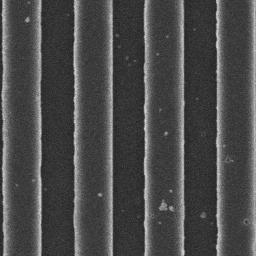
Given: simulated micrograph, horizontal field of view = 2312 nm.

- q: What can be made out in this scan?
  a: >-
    lines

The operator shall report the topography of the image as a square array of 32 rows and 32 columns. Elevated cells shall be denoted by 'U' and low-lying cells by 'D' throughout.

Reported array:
UUUUUDDDDUUUUUDDDDUUUUUDDDDUUUUU
UUUUUDDDDUUUUUDDDDUUUUUDDDDUUUUU
UUUUUDDDDUUUUUDDDDUUUUUDDDDUUUUU
UUUUUDDDDUUUUUDDDDUUUUUDDDDUUUUU
UUUUUDDDDUUUUUDDDDUUUUUDDDDUUUUU
UUUUUDDDDUUUUUDDDDUUUUUDDDDUUUUU
UUUUUDDDDUUUUUDDDDUUUUUDDDDUUUUU
UUUUUDDDDUUUUUDDDDUUUUUDDDDUUUUU
UUUUUDDDDUUUUUDDDDUUUUUDDDDUUUUU
UUUUUDDDDUUUUUDDDDUUUUUDDDDUUUUU
UUUUUDDDDUUUUUDDDDUUUUUDDDDUUUUU
UUUUUDDDDUUUUUDDDDUUUUUDDDDUUUUU
UUUUUDDDDUUUUUDDDDUUUUUDDDDUUUUU
UUUUUDDDDUUUUUDDDDUUUUUDDDDUUUUU
UUUUUDDDDUUUUUDDDDUUUUUDDDDUUUUU
UUUUUDDDDUUUUUDDDDUUUUUDDDDUUUUU
UUUUUDDDDUUUUUDDDDUUUUUDDDDUUUUU
UUUUUDDDDUUUUUDDDDUUUUUDDDDUUUUU
UUUUUDDDDUUUUUDDDDUUUUUDDDDUUUUU
UUUUUDDDDUUUUUDDDDUUUUUDDDDUUUUU
UUUUUDDDDUUUUUDDDDUUUUUDDDDUUUUU
UUUUUDDDDDUUUUDDDDUUUUUDDDDUUUUU
UUUUUDDDDUUUUUDDDDUUUUUDDDDUUUUU
UUUUUDDDDUUUUUDDDDUUUUUDDDDUUUUU
UUUUUDDDDUUUUUDDDDUUUUUDDDDUUUUU
UUUUUDDDDUUUUUDDDDUUUUUDDDDUUUUU
UUUUUDDDDUUUUUDDDDUUUUUDDDDUUUUU
UUUUUDDDDUUUUUDDDDUUUUUDDDDUUUUU
UUUUUDDDDUUUUUDDDDUUUUUDDDDUUUUU
UUUUUDDDDDUUUUDDDDUUUUUDDDDUUUUU
DUUUUDDDDDUUUUDDDDUUUUUDDDDUUUUU
UUUUUDDDDDUUUUDDDDUUUUUDDDDUUUUU